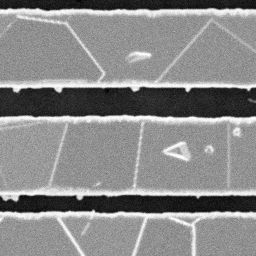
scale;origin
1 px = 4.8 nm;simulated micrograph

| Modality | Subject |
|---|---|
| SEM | lines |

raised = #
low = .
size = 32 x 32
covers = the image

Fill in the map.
................................
################################
################################
################################
################################
################################
################################
################################
################################
################################
################################
................................
................................
................................
................................
################################
################################
################################
################################
################################
################################
################################
################################
################################
................................
................................
................................
################################
################################
################################
################################
################################